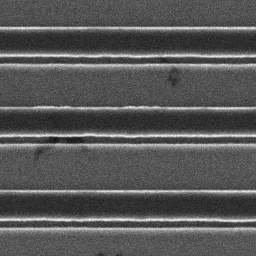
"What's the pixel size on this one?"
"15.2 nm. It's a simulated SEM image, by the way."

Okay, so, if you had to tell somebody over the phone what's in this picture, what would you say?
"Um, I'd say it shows lines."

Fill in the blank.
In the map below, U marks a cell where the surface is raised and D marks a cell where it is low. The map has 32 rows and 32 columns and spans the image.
DDDDDDDDDDDDDDDDDDDDDDDDDDDDDDDD
DDDDDDDDDDDDDDDDDDDDDDDDDDDDDDDD
DDDDDDDDDDDDDDDDDDDDDDDDDDDDDDDD
UUUUUUUUUUUUUUUUUUUUUUUUUUUUUUUU
UUUUUUUUUUUUUUUUUUUUUUUUUUUUUUUU
UUUUUUUUUUUUUUUUUUUUUUUUUUUUUUUU
UUUUUUUUUUUUUUUUUUUUUUUUUUUUUUUU
DDDDDDDDDDDDDDDDDDDDDDDDDDDDDDDD
DDDDDDDDDDDDDDDDDDDDDDDDDDDDDDDD
DDDDDDDDDDDDDDDDDDDDDDDDDDDDDDDD
DDDDDDDDDDDDDDDDDDDDDDDDDDDDDDDD
DDDDDDDDDDDDDDDDDDDDDDDDDDDDDDDD
DDDDDDDDDDDDDDDDDDDDDDDDDDDDDDDD
UUUUUUUUUUUUUUUUUUUUUUUUUUUUUUUU
UUUUUUUUUUUUUUUUUUUUUUUUUUUUUUUU
UUUUUUUUUUUUUUUUUUUUUUUUUUUUUUUU
UUUUUUUUUUUUUUUUUUUUUUUUUUUUUUUU
DDDDDDDDDDDDDDDDDDDDDDDDDDDDDDDD
DDDDDDDDDDDDDDDDDDDDDDDDDDDDDDDD
DDDDDDDDDDDDDDDDDDDDDDDDDDDDDDDD
DDDDDDDDDDDDDDDDDDDDDDDDDDDDDDDD
DDDDDDDDDDDDDDDDDDDDDDDDDDDDDDDD
DDDDDDDDDDDDDDDDDDDDDDDDDDDDDDDD
DDDDDDDDDDDDDDDDDDDDDDDDDDDDDDDD
UUUUUUUUUUUUUUUUUUUUUUUUUUUUUUUU
UUUUUUUUUUUUUUUUUUUUUUUUUUUUUUUU
UUUUUUUUUUUUUUUUUUUUUUUUUUUUUUUU
UDUUDDUUUUUUUUUUUUUUUUUUUUUUUUUU
DDDDDDDDDDDDDDDDDDDDDDDDDDDDDDDD
DDDDDDDDDDDDDDDDDDDDDDDDDDDDDDDD
DDDDDDDDDDDDDDDDDDDDDDDDDDDDDDDD
DDDDDDDDDDDDDDDDDDDDDDDDDDDDDDDD